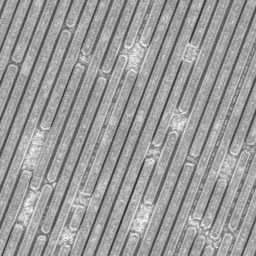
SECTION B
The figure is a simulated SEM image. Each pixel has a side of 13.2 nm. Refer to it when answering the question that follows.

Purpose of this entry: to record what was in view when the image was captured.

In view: parallel lines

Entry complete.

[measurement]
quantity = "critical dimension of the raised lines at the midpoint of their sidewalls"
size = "114 nanometres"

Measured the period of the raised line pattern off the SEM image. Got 165 nm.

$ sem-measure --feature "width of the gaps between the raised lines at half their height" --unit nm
51